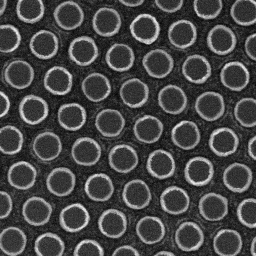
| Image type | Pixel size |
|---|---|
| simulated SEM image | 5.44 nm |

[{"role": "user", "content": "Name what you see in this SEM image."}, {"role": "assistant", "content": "a regular array of raised bodies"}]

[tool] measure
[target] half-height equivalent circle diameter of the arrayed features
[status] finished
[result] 147 nanometers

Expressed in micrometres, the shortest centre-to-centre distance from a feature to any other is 0.206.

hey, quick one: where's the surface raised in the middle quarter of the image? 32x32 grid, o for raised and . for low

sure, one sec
............ooooo...ooooooo...oo
.............oo......ooooo....oo
o.....................oooo....oo
oo....oooo.....................o
oo...oooooo.....ooo.............
oo...oooooo....ooooo............
o....oooooo...ooooooo....oooo...
.....oooooo...ooooooo...oooooo..
......oooo.....oooooo...oooooo..
...............ooooo....oooooo..
oooo.............o......oooooo..
ooooo....................oooo...
ooooo....ooooo..................
ooooo...oooooo......ooo.........
ooooo...ooooooo...oooooo.....oo.
oooo....ooooooo...oooooo....oooo
.........ooooo....oooooo...ooooo
..........ooo.....oooooo...ooooo
...................ooooo...ooooo
...ooooo.............o......oooo
..ooooooo.....oo.............ooo
..ooooooo...ooooo...............
..ooooooo...oooooo....oooo......
..ooooooo...oooooo...oooooo.....
...ooooo....oooooo...oooooo....o
............oooooo...ooooooo...o
o............ooo.....oooooo....o
oo....................ooooo....o
oo....ooooo....................o
oo....oooooo.....ooo............
oo...ooooooo...oooooo...........
oo...ooooooo...oooooo.....ooo...